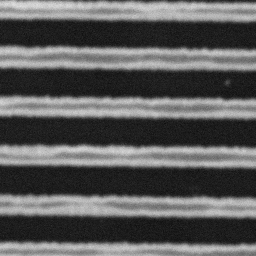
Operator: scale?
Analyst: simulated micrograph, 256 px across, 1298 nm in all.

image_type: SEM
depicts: lines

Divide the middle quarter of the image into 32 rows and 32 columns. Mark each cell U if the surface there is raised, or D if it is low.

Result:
UUUUUUUUUUUUUUUUUUUUUUUUUUUUUUUU
DDDDDDDDDDDDDDDDDDDDDDDDDDDDDDDD
DDDDDDDDDDDDDDDDDDDDDDDDDDDDDDDD
DDDDDDDDDDDDDDDDDDDDDDDDDDDDDDDD
DDDDDDDDDDDDDDDDDDDDDDDDDDDDDDDD
DDDDDDDDDDDDDDDDDDDDDDDDDDDDDDDD
DDDDDDDDDDDDDDDDDDDDDDDDDDDDDDDD
DDDDDDDDDDDDDDDDDDDDDDDDDDDDDDDD
DDDDDDDDDDDDDDDDDDDDDDDDDDDDDDDD
UUUUUUUUUUUUUUUUUUUUUUUUUUUUUUUU
UUUUUUUUUUUUUUUUUUUUUUUUUUUUUUUU
UUUUUUUUUUUUUUUUUUUUUUUUUUUUUUUU
UUUUUUUUUUUUUUUUUUUUUUUUUUUUUUUU
DDDDDDDDDDDDDDDDDDDDDDDDDDDDDDDD
DDDDDDDDDDDDDDDDDDDDDDDDDDDDDDDD
DDDDDDDDDDDDDDDDDDDDDDDDDDDDDDDD
DDDDDDDDDDDDDDDDDDDDDDDDDDDDDDDD
DDDDDDDDDDDDDDDDDDDDDDDDDDDDDDDD
DDDDDDDDDDDDDDDDDDDDDDDDDDDDDDDD
DDDDDDDDDDDDDDDDDDDDDDDDDDDDDDDD
DDDDDDDDDDDDDDDDDDDDDDDDDDDDDDDD
UUUUUUUUUUUUUUUUUUDUUUUUUUUUUUUU
UUUUUUUUUUUUUUUUUUUUUUUUUUUUUUUU
UUUUUUUUUUUUUUUUUUUUUUUUUUUUUUUU
UUUUUUUUUUUUUUUUUUUUUUUUUUUUUUUU
DDDDDDDDDDDDDDDDDDDDDDDDDDDDDDDD
DDDDDDDDDDDDDDDDDDDDDDDDDDDDDDDD
DDDDDDDDDDDDDDDDDDDDDDDDDDDDDDDD
DDDDDDDDDDDDDDDDDDDDDDDDDDDDDDDD
DDDDDDDDDDDDDDDDDDDDDDDDDDDDDDDD
DDDDDDDDDDDDDDDDDDDDDDDDDDDDDDDD
DDDDDDDDDDDDDDDDDDDDDDDDDDDDDDDD